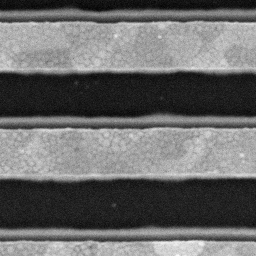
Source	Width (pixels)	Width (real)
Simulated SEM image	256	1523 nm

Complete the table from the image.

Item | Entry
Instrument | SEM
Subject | lines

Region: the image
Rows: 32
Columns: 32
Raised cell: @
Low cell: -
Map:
--------------------------------
--------------------------------
@@@@@@@@@@@@@@@@@@@@@@@@@@@@@@@@
@@@@@@@@@@@@@@@@@@@@@@@@@@@@@@@@
@@@@@@@@@@@@@@@@@@@@@@@@@@@@@@@@
@@@@@@@@@@@@@@@@@@@@@@@@@@@@@@@@
@@@@@@@@@@@@@@@@@@@@@@@@@@@@@@@@
@@@@@@@@@@@@@@@@@@@@@@@@@@@@@@@@
@@@@@@@@@@@@@@@@@@@@@@@@@@@@@@@@
--------------------------------
--------------------------------
--------------------------------
--------------------------------
--------------------------------
--------------------------------
@@@@@@@@@@@@@@@@@@@@@@@@@@@@@@@@
@@@@@@@@@@@@@@@@@@@@@@@@@@@@@@@@
@@@@@@@@@@@@@@@@@@@@@@@@@@@@@@@@
@@@@@@@@@@@@@@@@@@@@@@@@@@@@@@@@
@@@@@@@@@@@@@@@@@@@@@@@@@@@@@@@@
@@@@@@@@@@@@@@@@@@@@@@@@@@@@@@@@
@@@@@@@@@@@@@@@@@@@@@@@@@@@@@@@@
--------------------------------
--------------------------------
--------------------------------
--------------------------------
--------------------------------
--------------------------------
--------------------------------
@@@@@@@@@@@@@@@@@@@@@@@@@@@@@@@@
@@@@@@@@@@@@@@@@@@@@@@@@@@@@@@@@
@@@@@@@@@@@@@@@@@@@@@@@@@@@@@@@@